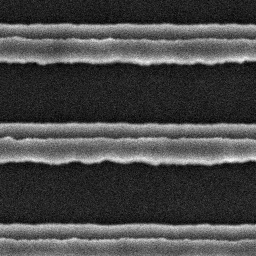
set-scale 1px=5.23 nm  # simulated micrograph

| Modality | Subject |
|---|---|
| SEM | lines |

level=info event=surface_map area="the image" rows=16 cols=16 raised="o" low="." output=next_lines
................
................
oooooooooooooooo
oooooooooooooooo
................
................
................
................
oooooooooooooooo
oooooooooooooooo
................
................
................
................
oooooooooooooooo
oooooooooooooooo